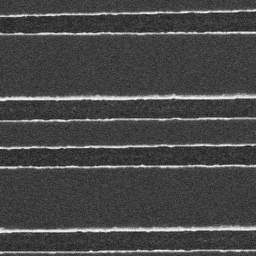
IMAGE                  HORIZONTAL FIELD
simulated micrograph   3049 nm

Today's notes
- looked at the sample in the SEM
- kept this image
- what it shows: lines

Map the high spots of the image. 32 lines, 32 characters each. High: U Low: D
UUUUUUUUUUUUUUUUUUUUUUUUUUUUUUUU
UUUUUUUUUUUUUUUUUUUUUUUUUUDDDDDD
DDDDDDDDDDDDDDDDDDDDDDDDDDDDDDDD
DDDDDDDDDDDDDDDDDDDDDDDDDDDDDDDD
UUUUUUUUUUUUUUUUUUUUUUUUUUUUUUUU
UUUUUUUUUUUUUUUUUUUUUUUUUUUUUUUU
UUUUUUUUUUUUUUUUUUUUUUUUUUUUUUUU
UUUUUUUUUUUUUUUUUUUUUUUUUUUUUUUU
UUUUUUUUUUUUUUUUUUUUUUUUUUUUUUUU
UUUUUUUUUUUUUUUUUUUUUUUUUUUUUUUU
UUUUUUUUUUUUUUUUUUUUUUUUUUUUUUUU
UUUUUUUUUUUUUUUUUUUUUUUUUUUUUUUU
DDDDDDDDDDDDDDDDDDDDDDDDDDDDDDDD
DDDDDDDDDDDDDDDDDDDDDDDDDDDDDDDD
DDDDDDDDDDDDDDDDDDDDDDDDDDDDDDDD
UUUUUUUUUUUUUUUUUUUUUUUUUUUUUUUU
UUUUUUUUUUUUUUUUUUUUUUUUUUUUUUUU
UUUUUUUUUUUUUUUUUUUUUUUUUUUUUUUU
UUUUDDUUUDDDDDDDDDDDDDDDDDDDDDDD
DDDDDDDDDDDDDDDDDDDDDDDDDDDDDDDD
DDDDDDDDDDDDDDDDDDDDDDDDDDDDDDDD
UUUUUUUUUUUUUUUUUUUUUUUUUUUUUUUU
UUUUUUUUUUUUUUUUUUUUUUUUUUUUUUUU
UUUUUUUUUUUUUUUUUUUUUUUUUUUUUUUU
UUUUUUUUUUUUUUUUUUUUUUUUUUUUUUUU
UUUUUUUUUUUUUUUUUUUUUUUUUUUUUUUU
UUUUUUUUUUUUUUUUUUUUUUUUUUUUUUUU
UUUUUUUUUUUUUUUUUUUUUUUUUUUUUUUU
UUUUUUUUUUUUUUUUUUUUUUUUUUUUUUUU
DDDDDDDDDDDDDDDDDDDDDDDDDDDDDDDD
DDDDDDDDDDDDDDDDDDDDDDDDDDDDDDDD
DDDDDDDDDDDUUUUUUUUUUUUUUUUUUUUU